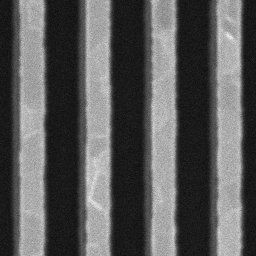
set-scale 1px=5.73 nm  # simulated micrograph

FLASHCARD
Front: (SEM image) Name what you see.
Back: lines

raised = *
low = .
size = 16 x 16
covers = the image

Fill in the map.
.**..**..**..**.
.**..**..**..**.
.**..**..**..**.
.**..**..**..**.
.**..**..**..**.
.**..**..**..**.
.**..**..**..**.
.**..**..**..**.
.**..**..**..**.
.**..**..**..**.
.**..**..**..**.
.**..**..**..**.
.**..**..**..**.
.**..**..**..**.
.**..**..**..**.
.**..**..**..**.